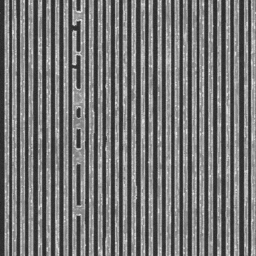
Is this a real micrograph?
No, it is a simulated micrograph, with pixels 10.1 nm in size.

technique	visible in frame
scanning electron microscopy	parallel lines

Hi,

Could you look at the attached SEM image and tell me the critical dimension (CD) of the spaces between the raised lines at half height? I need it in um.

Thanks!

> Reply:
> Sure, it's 0.0457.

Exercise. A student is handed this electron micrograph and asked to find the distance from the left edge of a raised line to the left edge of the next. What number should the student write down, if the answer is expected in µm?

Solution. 0.0861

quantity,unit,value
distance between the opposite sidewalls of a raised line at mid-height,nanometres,45.7